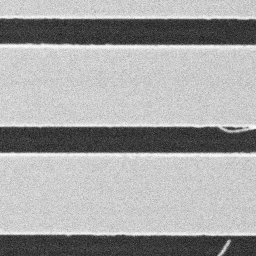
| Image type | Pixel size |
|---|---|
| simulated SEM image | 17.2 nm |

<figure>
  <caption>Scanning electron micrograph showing lines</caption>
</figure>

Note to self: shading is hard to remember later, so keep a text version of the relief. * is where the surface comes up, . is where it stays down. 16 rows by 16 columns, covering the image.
****************
................
................
****************
****************
****************
****************
****************
................
................
****************
****************
****************
****************
****************
................